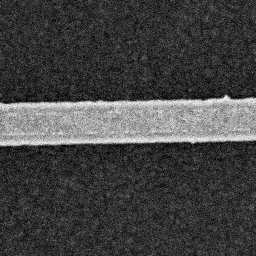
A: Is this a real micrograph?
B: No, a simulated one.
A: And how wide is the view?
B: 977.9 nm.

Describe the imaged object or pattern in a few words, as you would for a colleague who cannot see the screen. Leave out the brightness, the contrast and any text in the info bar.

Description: one or a few lines or trenches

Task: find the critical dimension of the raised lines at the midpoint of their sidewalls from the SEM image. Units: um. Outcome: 0.148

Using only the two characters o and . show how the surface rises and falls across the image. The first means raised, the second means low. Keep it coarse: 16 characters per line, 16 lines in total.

................
................
................
................
................
................
....oooooooooooo
oooooooooooooooo
oooooooooooooooo
................
................
................
................
................
................
................